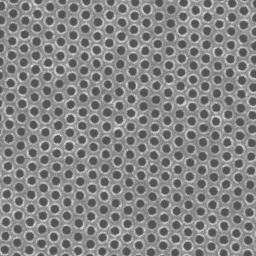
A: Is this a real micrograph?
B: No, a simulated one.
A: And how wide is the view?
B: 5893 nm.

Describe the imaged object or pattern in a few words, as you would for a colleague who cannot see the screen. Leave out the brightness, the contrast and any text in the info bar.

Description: a regular array of holes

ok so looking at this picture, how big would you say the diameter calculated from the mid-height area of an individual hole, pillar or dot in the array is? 0.208 um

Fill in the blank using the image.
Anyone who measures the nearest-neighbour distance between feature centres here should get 314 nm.